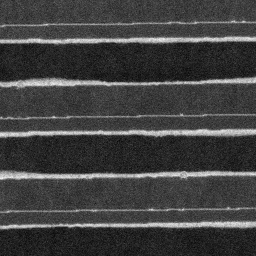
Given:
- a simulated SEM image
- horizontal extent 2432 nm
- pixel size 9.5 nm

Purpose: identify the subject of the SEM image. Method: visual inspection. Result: lines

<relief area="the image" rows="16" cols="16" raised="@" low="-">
@@@@@@@@@@@@@@@@
@@@@@@@@@@@@@@@@
@@@@@@@@@-------
----------------
----------------
@@@@@@@@@@@@@@@@
@@@@@@@@@@@@@@@@
@@@@@@@@@@@@@@@@
----------------
----------------
----------------
@@@@@@@@@@@@@@@@
@@@@@@@@@@@@@@@@
@@@@@@@@@@@@@@@@
----------------
----------------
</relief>